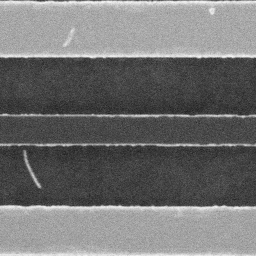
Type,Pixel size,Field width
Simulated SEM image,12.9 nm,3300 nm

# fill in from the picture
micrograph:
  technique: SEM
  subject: lines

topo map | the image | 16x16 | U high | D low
UUUUUUUUUUUUUUUU
UUUUUUUUUUUUUUUU
UUUUUUUUUUUUUUUU
UUUUUUUUUUUUUUUU
DDDDDDDDDDDDDDDD
DDDDDDDDDDDDDDDD
DDDDDDDDDDDDDDDD
UUUUUUUUUUUUUUUU
UUUUUUUUUUUUUUUU
DDDDDDDDDDDDDDDD
DDDDDDDDDDDDDDDD
DDDDDDDDDDDDDDDD
DDDDDDDDDDDDDDDD
UUUUUUUUUUUUUUUU
UUUUUUUUUUUUUUUU
UUUUUUUUUUUUUUUU